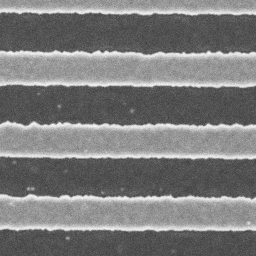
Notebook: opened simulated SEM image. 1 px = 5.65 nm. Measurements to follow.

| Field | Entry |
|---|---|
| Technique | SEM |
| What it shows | lines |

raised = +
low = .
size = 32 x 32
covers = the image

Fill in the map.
++++++++++++++++++++++++++++++++
++++++++++++++++++++++++++++++++
................................
................................
................................
................................
++++..++.+..+++.................
++++++++++++++++++++++++++++++++
++++++++++++++++++++++++++++++++
++++++++++++++++++++++++++++++++
++++++++++++++++++++++++++++++++
................................
................................
................................
................................
++..+..++.......................
++++++++++++++++++++++++++++++++
++++++++++++++++++++++++++++++++
++++++++++++++++++++++++++++++++
++++++++++++++++++++++++++++++++
................................
................................
................................
................................
+..++.....+.....................
++++++++++++++++++++++++++++++++
++++++++++++++++++++++++++++++++
++++++++++++++++++++++++++++++++
++++++++++++++++++++++++++++++++
................................
................................
................................